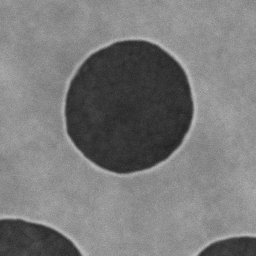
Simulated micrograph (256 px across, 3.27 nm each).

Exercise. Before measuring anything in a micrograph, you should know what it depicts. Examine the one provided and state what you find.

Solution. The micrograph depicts holes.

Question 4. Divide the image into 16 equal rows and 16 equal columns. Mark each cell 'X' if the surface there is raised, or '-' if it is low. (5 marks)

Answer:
XXXXXXXXXXXXXXXX
XXXXXXXXXXXXXXXX
XXXXXXXXXXXXXXXX
XXXXXX-----XXXXX
XXXXX-------XXXX
XXXX--------XXXX
XXXX--------XXXX
XXXX--------XXXX
XXXX--------XXXX
XXXXX------XXXXX
XXXXXX---XXXXXXX
XXXXXXXXXXXXXXXX
XXXXXXXXXXXXXXXX
XXXXXXXXXXXXXXXX
----XXXXXXXXXXXX
-----XXXXXXXX---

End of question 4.